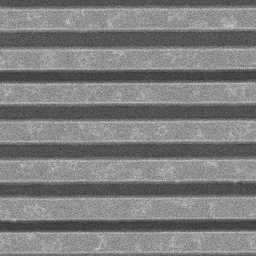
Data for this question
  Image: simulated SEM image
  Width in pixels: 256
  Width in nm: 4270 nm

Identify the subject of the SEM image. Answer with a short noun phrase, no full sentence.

parallel lines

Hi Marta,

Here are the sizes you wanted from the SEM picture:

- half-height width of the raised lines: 373 nanometres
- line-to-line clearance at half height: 15.6 px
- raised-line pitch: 621 nanometers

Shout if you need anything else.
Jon